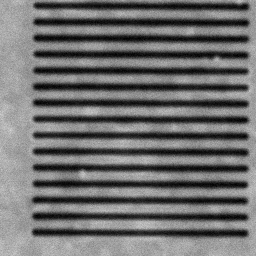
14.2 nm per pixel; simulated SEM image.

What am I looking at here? groups of lines, slits or small figures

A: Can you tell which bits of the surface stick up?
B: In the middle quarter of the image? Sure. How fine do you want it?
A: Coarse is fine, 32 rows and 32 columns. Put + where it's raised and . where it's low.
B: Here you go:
++++++++++++++++++++++++++++++++
................................
................................
++++++++++++++++++++++++++++++++
++++++++++++++++++++++++++++++++
................................
................................
++++++++++++++++++++++++++++++++
++++++++++++++++++++++++++++++++
................................
................................
++++++++++++++++++++++++++++++++
++++++++++++++++++++++++++++++++
................................
................................
++++++++++++++++++++++++++++++++
++++++++++++++++++++++++++++++++
................................
................................
++++++++++++++++++++++++++++++++
++++++++++++++++++++++++++++++++
................................
................................
++++++++++++++++++++++++++++++++
++++++++++++++++++++++++++++++++
................................
................................
++++++++++++++++++++++++++++++++
++++++++++++++++++++++++++++++++
................................
................................
++++++++++++++++++++++++++++++++